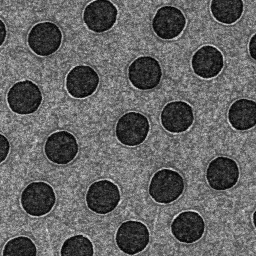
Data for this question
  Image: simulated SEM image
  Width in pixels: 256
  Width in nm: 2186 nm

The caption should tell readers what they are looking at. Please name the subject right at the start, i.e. a regular array of holes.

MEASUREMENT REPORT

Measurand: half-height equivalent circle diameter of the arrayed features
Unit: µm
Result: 0.291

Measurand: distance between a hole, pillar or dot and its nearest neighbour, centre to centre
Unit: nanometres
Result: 476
